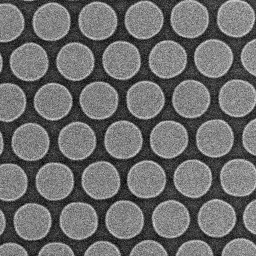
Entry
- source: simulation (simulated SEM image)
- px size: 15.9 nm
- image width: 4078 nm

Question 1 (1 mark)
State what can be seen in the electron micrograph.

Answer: an array of small figures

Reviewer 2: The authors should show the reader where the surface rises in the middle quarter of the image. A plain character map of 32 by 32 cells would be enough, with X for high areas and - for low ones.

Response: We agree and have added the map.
XXXXXXX---XXXXXXXXX--XXXXXXXXX--
XXXXXXX---XXXXXXXX----XXXXXXXX--
XXXXXX-----XXXXXXX-----XXXXX----
-XXXX--------XXX----------------
-------------------XX---------XX
------XXXXXX-----XXXXXX-----XXXX
X----XXXXXXXX---XXXXXXXX----XXXX
X---XXXXXXXXX---XXXXXXXXX--XXXXX
XX--XXXXXXXXX---XXXXXXXXX--XXXXX
XX--XXXXXXXXX---XXXXXXXXX--XXXXX
XX--XXXXXXXXX---XXXXXXXXX--XXXXX
X----XXXXXXXX---XXXXXXXX----XXXX
X----XXXXXXX-----XXXXXX------XXX
-------XXX---------XX-----------
-------------XXX--------XXXX----
-XXXXX------XXXXXX-----XXXXXXX--
XXXXXXX----XXXXXXXX---XXXXXXXX--
XXXXXXX---XXXXXXXXX---XXXXXXXXX-
XXXXXXXX--XXXXXXXXX---XXXXXXXXX-
XXXXXXXX--XXXXXXXXX---XXXXXXXXX-
XXXXXXXX--XXXXXXXXX---XXXXXXXX--
XXXXXXX----XXXXXXXX---XXXXXXXX--
XXXXXXX-----XXXXXX-----XXXXXX---
-XXXX--------XX-----------------
---------X---------XXX--------XX
------XXXXXX-----XXXXXXX-----XXX
X----XXXXXXXX----XXXXXXXX---XXXX
XX---XXXXXXXXX--XXXXXXXXX---XXXX
XX---XXXXXXXXX--XXXXXXXXX---XXXX
XX---XXXXXXXXX--XXXXXXXXX---XXXX
XX---XXXXXXXXX--XXXXXXXXX---XXXX
XX---XXXXXXXX----XXXXXXXX----XXX